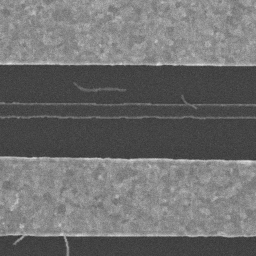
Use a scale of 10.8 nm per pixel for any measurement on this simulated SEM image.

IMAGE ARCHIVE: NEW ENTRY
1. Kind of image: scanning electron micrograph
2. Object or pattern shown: lines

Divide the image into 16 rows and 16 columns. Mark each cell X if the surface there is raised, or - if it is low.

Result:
XXXXXXXXXXXXXXXX
XXXXXXXXXXXXXXXX
XXXXXXXXXXXXXXXX
XXXXXXXXXXXXXXXX
----------------
----------------
----------------
----------------
----------------
----------------
XXXXXXXXXXXXXXXX
XXXXXXXXXXXXXXXX
XXXXXXXXXXXXXXXX
XXXXXXXXXXXXXXXX
XXXXXXXXXXXXXXXX
----------------